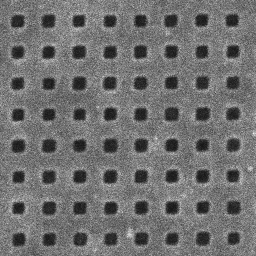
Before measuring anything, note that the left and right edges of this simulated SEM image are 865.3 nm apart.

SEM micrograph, a regular array of holes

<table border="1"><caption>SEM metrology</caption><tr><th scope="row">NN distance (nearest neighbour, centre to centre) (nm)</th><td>103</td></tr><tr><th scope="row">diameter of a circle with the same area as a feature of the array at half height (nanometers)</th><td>48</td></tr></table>